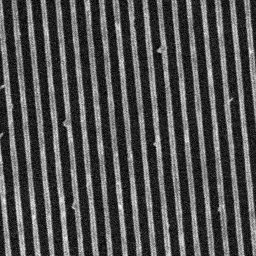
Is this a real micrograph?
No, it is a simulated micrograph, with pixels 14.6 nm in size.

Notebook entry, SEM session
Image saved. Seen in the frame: parallel lines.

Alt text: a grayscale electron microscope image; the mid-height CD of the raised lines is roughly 63.7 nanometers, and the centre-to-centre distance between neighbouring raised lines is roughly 212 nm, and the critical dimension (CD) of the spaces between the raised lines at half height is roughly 10.5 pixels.